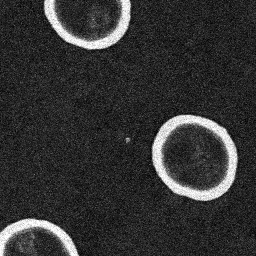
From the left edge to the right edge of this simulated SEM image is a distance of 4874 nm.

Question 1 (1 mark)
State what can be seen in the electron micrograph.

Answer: raised bodies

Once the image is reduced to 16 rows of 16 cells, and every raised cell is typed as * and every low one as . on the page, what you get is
...*****........
...*****........
.....**.........
................
................
................
................
...........*....
..........****..
..........****..
..........****..
...........***..
................
................
.***............
****............